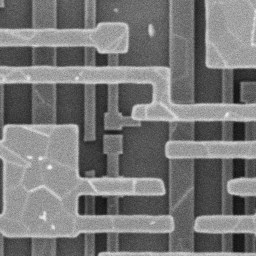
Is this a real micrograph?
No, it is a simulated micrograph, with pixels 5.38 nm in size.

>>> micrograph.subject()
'wiring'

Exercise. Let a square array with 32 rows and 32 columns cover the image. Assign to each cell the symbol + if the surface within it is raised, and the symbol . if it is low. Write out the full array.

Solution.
..........................++++++
..........................++++++
..........................++++++
............++++..........++++++
++++++++++++++++..........++++++
++++++++++++++++..........++++++
.............+++..........++++++
..........................++++++
+++++++++++++++++++++...........
+++++++++++++++++++++...........
...................++...........
...................++...........
...................++...........
.................+++++++++++++++
.................+++++++++++++++
................................
++++++++++......................
++++++++++......................
++++++++++...........+++++++++++
++++++++++...........+++++++++++
++++++++++......................
++++++++++......................
++++++++++++++++++++.........+++
+++++++++++++++++++++.......++++
++++++++++......................
++++++++++......................
++++++++++......................
++++++++++++++++++++++...+++++++
++++++++++++++++++++++..++++++++
.++++++++.......................
................................
................................